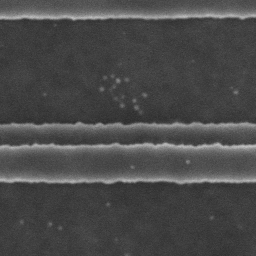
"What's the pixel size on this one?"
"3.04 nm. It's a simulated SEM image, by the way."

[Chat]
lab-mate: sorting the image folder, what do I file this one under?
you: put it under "lines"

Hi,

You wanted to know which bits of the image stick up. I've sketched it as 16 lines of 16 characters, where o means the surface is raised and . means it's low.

oooooooooooooooo
................
................
................
................
................
................
................
oooooooooooooooo
oooooooooooooooo
oooooooooooooooo
................
................
................
................
................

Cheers